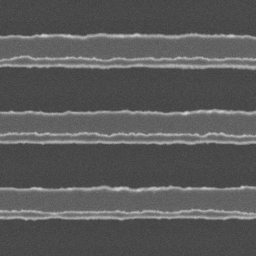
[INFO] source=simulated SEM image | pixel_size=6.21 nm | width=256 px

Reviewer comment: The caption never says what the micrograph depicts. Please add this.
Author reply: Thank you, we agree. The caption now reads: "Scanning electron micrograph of lines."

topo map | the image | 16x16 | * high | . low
................
................
****************
****************
................
................
................
****************
****************
................
................
................
****************
****************
................
................